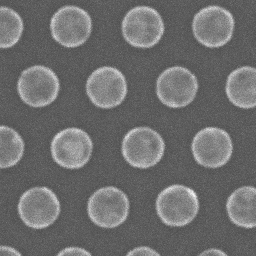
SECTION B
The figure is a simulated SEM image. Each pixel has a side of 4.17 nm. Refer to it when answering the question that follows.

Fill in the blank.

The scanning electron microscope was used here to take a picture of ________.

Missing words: a regular array of raised bodies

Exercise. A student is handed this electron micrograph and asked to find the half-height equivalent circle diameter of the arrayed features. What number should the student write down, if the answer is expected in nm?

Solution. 164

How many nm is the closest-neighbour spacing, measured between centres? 285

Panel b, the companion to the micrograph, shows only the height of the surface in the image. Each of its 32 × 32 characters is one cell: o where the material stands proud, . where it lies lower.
................................
oo.....ooo......ooo......ooo....
ooo....oooo.....oooo....ooooo...
ooo....oooo....ooooo....ooooo...
oo.....oooo.....oooo.....oooo...
oo......oo.......oo.......oo....
................................
................................
....o........o........o.........
...oooo....oooo.....oooo.....ooo
..ooooo....ooooo....ooooo...oooo
..ooooo....ooooo....oooo....oooo
...oooo.....ooo.....oooo.....ooo
................................
................................
................................
oo......oo......ooo......ooo....
ooo....oooo.....oooo....ooooo...
ooo....oooo....ooooo....ooooo...
ooo....oooo.....oooo....ooooo...
oo......oo.......oo......ooo....
................................
................................
.....................oo.......o.
...oooo.....oooo....oooo.....ooo
..ooooo....ooooo....ooooo....ooo
..ooooo....ooooo....ooooo....ooo
...oooo.....ooo.....oooo.....ooo
................................
................................
................................
oo......ooo.....ooo.......oo....